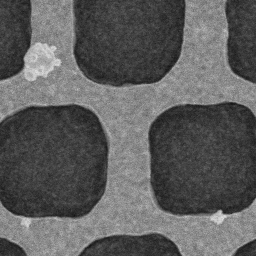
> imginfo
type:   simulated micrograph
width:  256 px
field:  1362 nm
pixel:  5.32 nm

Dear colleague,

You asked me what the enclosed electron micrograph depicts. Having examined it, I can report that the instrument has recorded holes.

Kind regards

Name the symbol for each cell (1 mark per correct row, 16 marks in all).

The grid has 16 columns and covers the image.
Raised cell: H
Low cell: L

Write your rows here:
LLHHHLLLLLLLHHLL
LLHHHLLLLLLLHHLL
LLHHHLLLLLLHHHLL
LLHHHLLLLLLHHHLL
LHHHHLLLLLLHHHHL
HHHHHHHHHHHHHHHH
HHHHHHHHHHHHHLLH
LLLLLLHHHHLLLLLL
LLLLLLLHHLLLLLLL
LLLLLLLHHLLLLLLL
LLLLLLLHHLLLLLLL
LLLLLLLHHLLLLLLL
LLLLLLHHHHLLLLLL
HLLLLHHHHHHLHHHH
HHHHHHHHHHHHHHHH
LHHHHLLLLLLHHHHL